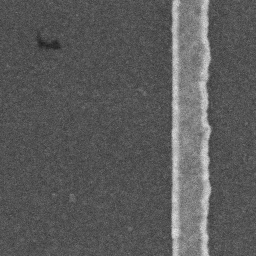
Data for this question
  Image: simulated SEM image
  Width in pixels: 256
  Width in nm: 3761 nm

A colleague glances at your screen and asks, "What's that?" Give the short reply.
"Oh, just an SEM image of one or a few lines or trenches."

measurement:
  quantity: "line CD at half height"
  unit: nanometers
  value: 444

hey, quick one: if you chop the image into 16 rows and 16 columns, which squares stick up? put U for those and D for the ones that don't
DDDDDDDDDDDUUDDD
DDDDDDDDDDDUUDDD
DDDDDDDDDDDUUDDD
DDDDDDDDDDDUUDDD
DDDDDDDDDDDUUDDD
DDDDDDDDDDDUUDDD
DDDDDDDDDDDUUDDD
DDDDDDDDDDDUUDDD
DDDDDDDDDDDUUDDD
DDDDDDDDDDDUUDDD
DDDDDDDDDDDUUDDD
DDDDDDDDDDDUUDDD
DDDDDDDDDDDUUDDD
DDDDDDDDDDDUUDDD
DDDDDDDDDDDUUDDD
DDDDDDDDDDDUUDDD